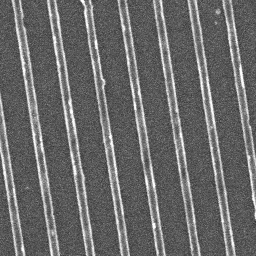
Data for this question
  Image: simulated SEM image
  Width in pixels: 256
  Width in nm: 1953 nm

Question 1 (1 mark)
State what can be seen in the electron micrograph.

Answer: parallel lines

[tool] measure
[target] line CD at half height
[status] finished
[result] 61.3 nm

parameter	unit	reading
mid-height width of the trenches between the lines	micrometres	0.206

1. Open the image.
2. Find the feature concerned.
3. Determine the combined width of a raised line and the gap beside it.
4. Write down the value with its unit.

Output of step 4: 265 nm